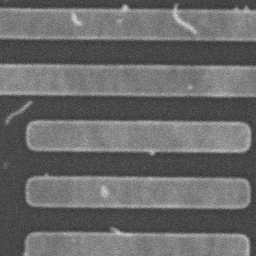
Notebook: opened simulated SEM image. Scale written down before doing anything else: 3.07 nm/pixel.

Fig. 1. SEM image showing groups of lines, slits or small figures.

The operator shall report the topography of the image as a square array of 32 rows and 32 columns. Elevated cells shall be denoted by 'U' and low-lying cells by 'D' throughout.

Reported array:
DDDDDDDDDDDDDDDDDDDDDDDDDDDDDDDD
UUUUUUUUUUUUUUUUUUUUUUUUUUUUUUUU
UUUUUUUUUUUUUUUUUUUUUUUUUUUUUUUU
UUUUUUUUUUUUUUUUUUUUUUUUUUUUUUUU
UUUUUUUUUUUUUUUUUUUUUUUUUUUUUUUU
DDDDDDDDDDDDDDDDDDDDDDDDDDDDDDDD
DDDDDDDDDDDDDDDDDDDDDDDDDDDDDDDD
DDDDDDDDDDDDDDDDDDDDDDDDDDDDDDDD
UUUUUUUUUUUUUUUUUUUUUUUUUUUUUUUU
UUUUUUUUUUUUUUUUUUUUUUUUUUUUUUUU
UUUUUUUUUUUUUUUUUUUUUUUUUUUUUUUU
UUUUUUUUUUUUUUUUUUUUUUUUUUUUUUUU
DDDDDDDDDDDDDDDDDDDDDDDDDDDDDDDD
DDDDDDDDDDDDDDDDDDDDDDDDDDDDDDDD
DDDDDDDDDDDDDDDDDDDDDDDDDDDDDDDD
DDDDUUUUUUUUUUUUUUUUUUUUUUUUUUUD
DDDUUUUUUUUUUUUUUUUUUUUUUUUUUUUD
DDDUUUUUUUUUUUUUUUUUUUUUUUUUUUUD
DDDDUUUUUUUUUUUUUUUUUUUUUUUUUUUD
DDDDDDDDDDDDDDDDDDDDDDDDDDDDDDDD
DDDDDDDDDDDDDDDDDDDDDDDDDDDDDDDD
DDDDDDDDDDDDDDDDDDDDDDDDDDDDDDDD
DDDDUUUUUUUUUUUUUUUUUUUUUUUUUUDD
DDDUUUUUUUUUUUUUUUUUUUUUUUUUUUUD
DDDUUUUUUUUUUUUUUUUUUUUUUUUUUUUD
DDDDUUUUUUUUUUUUUUUUUUUUUUUUUUUD
DDDDDDDDDDDDDDDDDDDDDDDDDDDDDDDD
DDDDDDDDDDDDDDDDDDDDDDDDDDDDDDDD
DDDDDDDDDDDDDDDDDDDDDDDDDDDDDDDD
DDDDUUUUUUUUUUUUUUUUUUUUUUUUUUUD
DDDUUUUUUUUUUUUUUUUUUUUUUUUUUUUD
DDDUUUUUUUUUUUUUUUUUUUUUUUUUUUUD